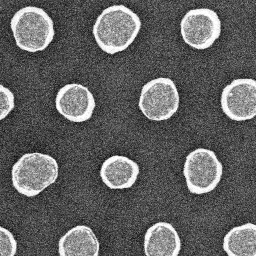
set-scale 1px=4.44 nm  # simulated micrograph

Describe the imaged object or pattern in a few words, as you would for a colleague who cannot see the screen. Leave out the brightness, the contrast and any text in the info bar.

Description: a regular array of raised bodies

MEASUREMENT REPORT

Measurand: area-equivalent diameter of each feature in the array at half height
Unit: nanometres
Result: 169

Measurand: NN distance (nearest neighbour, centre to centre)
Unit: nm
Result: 365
